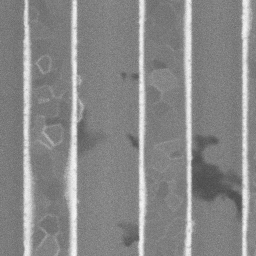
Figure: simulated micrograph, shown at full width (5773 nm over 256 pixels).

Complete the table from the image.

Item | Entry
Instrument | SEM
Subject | lines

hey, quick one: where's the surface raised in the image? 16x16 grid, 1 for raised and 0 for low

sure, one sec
0011100001110001
0011100001110001
0011100001110001
0011100001110001
0011100001110001
0011100001110001
0011100001110001
0011100001110001
0011100001110001
0011100001110001
0011100001110001
0011100001110001
0011100001110001
0011100001110001
0011100001110001
0011100001110001